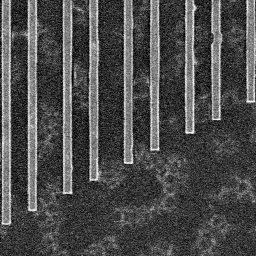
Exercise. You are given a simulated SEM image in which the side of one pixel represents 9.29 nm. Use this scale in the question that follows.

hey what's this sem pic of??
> parallel lines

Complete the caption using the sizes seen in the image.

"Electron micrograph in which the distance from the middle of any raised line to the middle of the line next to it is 278 nm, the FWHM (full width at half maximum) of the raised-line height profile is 73.2 nm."